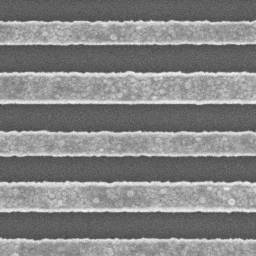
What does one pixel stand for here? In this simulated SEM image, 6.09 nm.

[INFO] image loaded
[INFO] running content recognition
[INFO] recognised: lines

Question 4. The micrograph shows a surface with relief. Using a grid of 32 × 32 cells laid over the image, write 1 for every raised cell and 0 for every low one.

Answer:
00000000000000000000000000000000
00000000000000000000000000000000
00000000000000000000000000000000
11111111111111111111111111111111
11111111111111111111111111111111
11110111111111111111111000110110
00000000000000000000000000000000
00000000000000000000000000000000
00000000000000000000000000000000
11111111111111111111111111111111
11111111111111111111111111111111
11111111111111111111111111111111
11111111111111111111111111111111
00000000000000000000000000000000
00000000000000000000000000000000
00000000000000000000000000000000
01011100000000000000000000000000
11111111111111111111111111111111
11111111111111111111111111111111
11100011110111111011111100010000
00000000000000000000000000000000
00000000000000000000000000000000
00000000000000000000000000000000
11111111111111111111111111111111
11111111111111111111111111111111
11111111111111111111111111111111
00000000000000000000000000000000
00000000000000000000000000000000
00000000000000000000000000000000
00000000000000000000000000000000
11111111111111111111111111111111
11111111111111111111111111111111